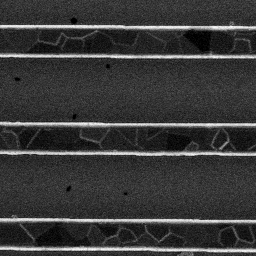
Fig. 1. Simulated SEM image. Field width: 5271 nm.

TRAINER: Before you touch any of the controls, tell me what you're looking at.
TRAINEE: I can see lines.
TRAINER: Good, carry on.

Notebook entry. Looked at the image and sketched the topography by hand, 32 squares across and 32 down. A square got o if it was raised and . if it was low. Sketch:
................................
................................
................................
oooooooooooooooooooooooooooooooo
oooooooooooooooooooooooooooooooo
oooooooooooooooooooooooooooooooo
oooooooooooooooooooooooooooooooo
................................
................................
................................
................................
................................
................................
................................
................................
oooooooooo......................
oooooooooooooooooooooooooooooooo
oooooooooooooooooooooooooooooooo
oooooooooooooooooooooooooooooooo
................................
................................
................................
................................
................................
................................
................................
................................
ooooooooooooooooo.oo............
oooooooooooooooooooooooooooooooo
oooooooooooooooooooooooooooooooo
oooooooooooooooooooooooooooooooo
................................